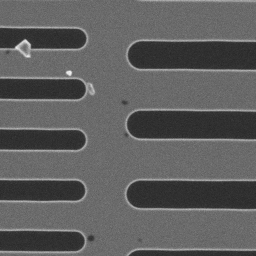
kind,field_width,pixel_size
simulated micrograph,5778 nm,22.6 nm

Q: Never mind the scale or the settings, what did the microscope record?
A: groups of lines, slits or small figures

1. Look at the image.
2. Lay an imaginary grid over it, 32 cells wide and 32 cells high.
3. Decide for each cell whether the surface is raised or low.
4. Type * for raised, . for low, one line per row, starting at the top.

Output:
********************************
********************************
********************************
.........***********************
...........*********************
..**.......******...............
****************................
****************................
*****************...............
********************************
...........*********************
...........*********************
********************************
********************************
****************................
****************................
..........******................
...........*********************
..........**********************
********************************
********************************
********************************
.........*********.....*********
...........*****................
..........******................
****************................
********************************
********************************
********************************
..........**********************
...........*********************
*****************...............